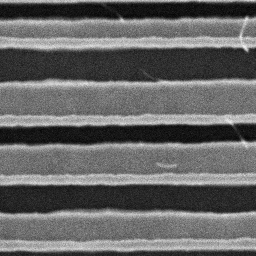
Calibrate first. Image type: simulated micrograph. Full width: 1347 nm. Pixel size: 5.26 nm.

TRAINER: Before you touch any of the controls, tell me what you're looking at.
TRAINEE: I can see lines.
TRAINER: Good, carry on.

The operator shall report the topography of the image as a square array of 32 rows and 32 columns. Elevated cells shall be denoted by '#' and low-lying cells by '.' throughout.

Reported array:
................................
................................
..#...#...####.######.##########
################################
################################
################################
................................
................................
................................
................................
################################
################################
################################
################################
################################
##############.##...............
................................
................................
################################
################################
################################
################################
################################
................................
................................
................................
.........#..###......#..........
################################
################################
################################
################################
................................